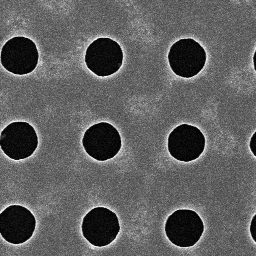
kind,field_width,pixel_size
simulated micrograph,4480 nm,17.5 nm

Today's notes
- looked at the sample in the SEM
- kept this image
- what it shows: holes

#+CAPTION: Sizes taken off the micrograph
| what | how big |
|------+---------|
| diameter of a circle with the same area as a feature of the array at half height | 674 nanometers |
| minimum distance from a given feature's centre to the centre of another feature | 1460 nanometers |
